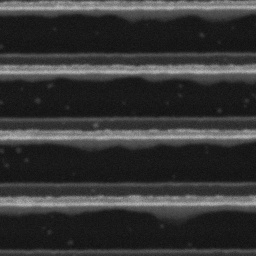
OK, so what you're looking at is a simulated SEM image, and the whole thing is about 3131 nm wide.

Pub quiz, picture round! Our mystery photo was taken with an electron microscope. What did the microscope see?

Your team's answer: lines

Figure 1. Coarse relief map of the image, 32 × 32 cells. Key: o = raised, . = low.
oooooooooooooooooooooooooooooooo
................................
................................
................................
................................
................................
................................
oooooooooooooooooooooooooooooooo
oooooooooooooooooooooooooooooooo
................................
................................
................................
................................
................................
................................
oooooooooooooooooooooooooooooooo
oooooooooooooooooooooooooooooooo
................................
................................
................................
................................
................................
................................
oooooooooooooooooooooooooooooooo
oooooooooooooooooooooooooooooooo
oooooooooooooooooooooooooooooooo
................................
................................
................................
................................
................................
oooooooooooooooooooooooooooooooo